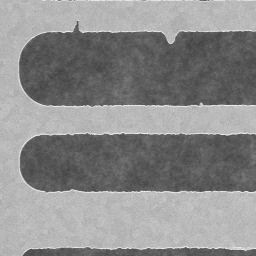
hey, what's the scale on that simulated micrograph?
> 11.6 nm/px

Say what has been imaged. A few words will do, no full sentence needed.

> one or a few lines or trenches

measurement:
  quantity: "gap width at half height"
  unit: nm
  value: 682